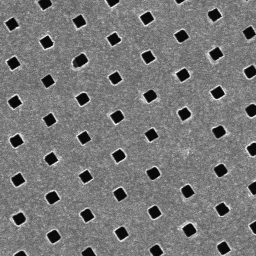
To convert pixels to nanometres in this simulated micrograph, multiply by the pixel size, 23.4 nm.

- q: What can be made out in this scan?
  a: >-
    a regular array of holes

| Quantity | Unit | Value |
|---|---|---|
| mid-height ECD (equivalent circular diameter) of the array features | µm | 0.287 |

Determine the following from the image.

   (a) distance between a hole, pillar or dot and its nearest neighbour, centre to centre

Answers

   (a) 904 nanometers